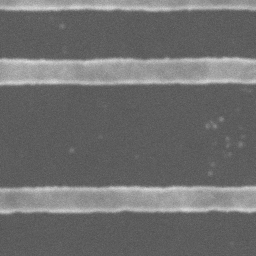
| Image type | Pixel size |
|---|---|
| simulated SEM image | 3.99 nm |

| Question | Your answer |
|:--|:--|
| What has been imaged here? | lines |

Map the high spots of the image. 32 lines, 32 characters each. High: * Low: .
********************************
................................
................................
................................
................................
................................
................................
****.*......********************
********************************
********************************
***.*.....*****.................
................................
................................
................................
................................
................................
................................
................................
................................
................................
................................
................................
................................
..******************************
********************************
********************************
****..******.**.................
................................
................................
................................
................................
................................